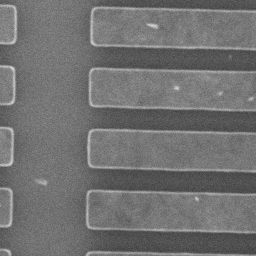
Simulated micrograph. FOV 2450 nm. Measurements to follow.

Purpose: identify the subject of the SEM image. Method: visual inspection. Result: groups of lines, slits or small figures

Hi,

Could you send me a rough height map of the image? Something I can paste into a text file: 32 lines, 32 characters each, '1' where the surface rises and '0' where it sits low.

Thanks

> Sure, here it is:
00000000000000000000000000000000
11000000000011111111111111111111
11000000000111111111111111111111
11000000000111111111111111111111
11000000000111111111111111111111
00000000000011111111111111111111
00000000000000000000000000000000
00000000000000000000000000000000
10000000000000000000000000000000
11000000000111111111111111111111
11000000000111111111111111111111
11000000000111111111111111111111
11000000000111111111111111111111
00000000000000000000011111111111
00000000000000000000000000000000
00000000000000000000000000000000
11000000000111111111111100000000
11000000000111111111111111111111
11000000000111111111111111111111
11000000000111111111111111111111
10000000000111111111111111111111
00000000000000000000000000000000
00000000000000000000000000000000
00000000000000000000000000000000
10000000000111111111111111111111
10000000000111111111111111111111
10000000000111111111111111111111
10000000000111111111111111111111
00000000000111111111111111111111
00000000000000000000000000000000
00000000000000000000000000000000
10000000000000000000000000000000